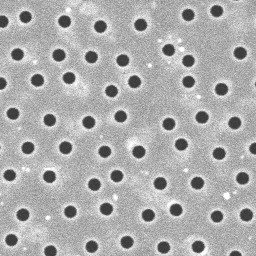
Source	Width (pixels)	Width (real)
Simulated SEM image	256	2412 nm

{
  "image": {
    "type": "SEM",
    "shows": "a regular array of holes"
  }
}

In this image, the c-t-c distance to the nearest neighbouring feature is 299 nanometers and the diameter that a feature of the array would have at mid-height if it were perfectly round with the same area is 123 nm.